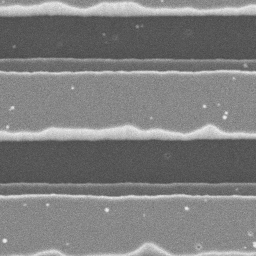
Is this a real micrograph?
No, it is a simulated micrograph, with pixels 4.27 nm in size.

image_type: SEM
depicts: lines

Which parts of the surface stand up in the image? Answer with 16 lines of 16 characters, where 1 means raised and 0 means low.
1111111111111111
0000000000000000
0000000000000000
0000000000000000
1000011111111111
1111111111111111
1111111111111111
1111111111111111
1111111111111111
0000000000000000
0000000000000000
0000000000000000
1111111111111111
1111111111111111
1111111111111111
1111111111111111